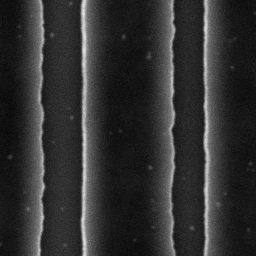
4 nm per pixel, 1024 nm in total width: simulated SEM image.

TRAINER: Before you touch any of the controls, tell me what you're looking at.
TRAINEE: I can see lines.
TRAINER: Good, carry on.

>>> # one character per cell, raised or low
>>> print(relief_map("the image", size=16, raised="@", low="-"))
@@@--@@@@@@--@@@
@@@--@@@@@@--@@@
@@@--@@@@@@--@@@
@@@--@@@@@@--@@@
@@@--@@@@@@--@@@
@@@--@@@@@@--@@@
@@@--@@@@@@--@@@
@@@--@@@@@@--@@@
@@@--@@@@@@--@@@
@@@--@@@@@@--@@@
@@@--@@@@@@--@@@
@@@--@@@@@@--@@@
@@@--@@@@@@--@@@
@@@--@@@@@@--@@@
@@@--@@@@@@--@@@
@@@--@@@@@@--@@@